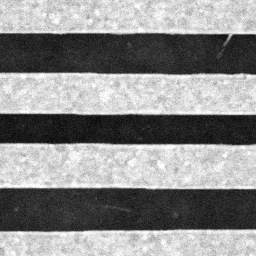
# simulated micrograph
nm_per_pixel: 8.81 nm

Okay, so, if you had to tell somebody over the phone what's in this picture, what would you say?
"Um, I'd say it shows lines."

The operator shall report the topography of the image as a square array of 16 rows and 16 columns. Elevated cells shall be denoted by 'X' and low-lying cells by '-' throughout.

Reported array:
XXXXXXXXXXXXXXXX
XXXXXXXXXXXXXXXX
----------------
----------------
----------------
XXXXXXXXXXXXXXXX
XXXXXXXXXXXXXXXX
----------------
----------------
XXXXXXXXXXXXXXXX
XXXXXXXXXXXXXXXX
XXXXXXXXXXXXXXXX
----------------
----------------
-----XXXXXXXXXXX
XXXXXXXXXXXXXXXX